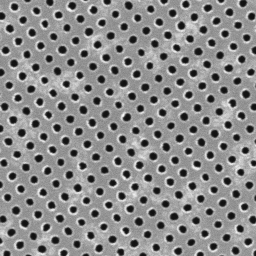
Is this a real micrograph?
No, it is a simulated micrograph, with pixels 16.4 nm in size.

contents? a regular array of holes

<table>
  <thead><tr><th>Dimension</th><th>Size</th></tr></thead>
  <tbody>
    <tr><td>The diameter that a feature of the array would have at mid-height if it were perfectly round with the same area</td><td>0.135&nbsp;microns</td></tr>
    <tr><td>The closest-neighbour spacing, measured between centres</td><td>252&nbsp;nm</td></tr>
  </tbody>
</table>